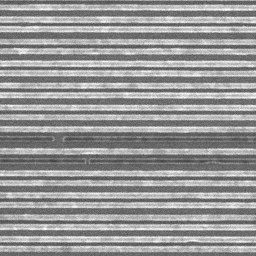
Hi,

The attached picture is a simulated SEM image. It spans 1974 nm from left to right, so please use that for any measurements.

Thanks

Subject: parallel lines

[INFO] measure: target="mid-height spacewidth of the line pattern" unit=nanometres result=40.5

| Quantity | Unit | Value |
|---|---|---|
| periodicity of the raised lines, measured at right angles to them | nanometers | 84.8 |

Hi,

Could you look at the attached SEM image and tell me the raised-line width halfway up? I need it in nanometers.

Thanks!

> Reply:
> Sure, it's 39.5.